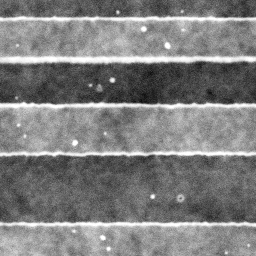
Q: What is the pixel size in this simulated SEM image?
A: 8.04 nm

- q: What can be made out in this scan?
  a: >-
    lines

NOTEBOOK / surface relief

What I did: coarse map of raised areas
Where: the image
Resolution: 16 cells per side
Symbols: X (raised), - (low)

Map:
----------------
XXXXXXXXXXXXXXXX
XXXXXXXXXXXXXXXX
XXXXXXXXXXXXXXXX
----------------
----------------
----------------
XXXXXXXXXXXXXXXX
XXXXXXXXXXXXXXXX
XXXXXXXXXXXXXXXX
----------------
----------------
----------------
----------------
XXXXXXXXXXXXXXXX
XXXXXXXXXXXXXXXX